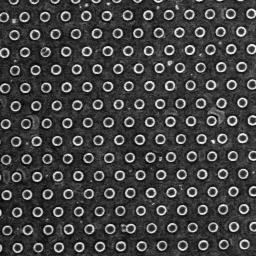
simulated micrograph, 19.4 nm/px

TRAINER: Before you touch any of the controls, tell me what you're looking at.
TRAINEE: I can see a regular array of raised bodies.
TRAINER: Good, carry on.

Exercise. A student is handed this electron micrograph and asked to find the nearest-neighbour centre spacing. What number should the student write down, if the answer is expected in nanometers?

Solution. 395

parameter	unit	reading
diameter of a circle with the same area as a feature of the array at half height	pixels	9.23